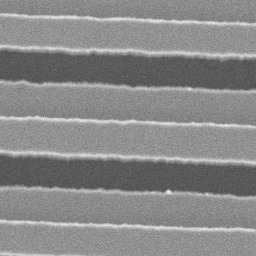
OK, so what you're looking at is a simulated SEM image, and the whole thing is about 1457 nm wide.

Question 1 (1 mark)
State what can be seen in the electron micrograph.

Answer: lines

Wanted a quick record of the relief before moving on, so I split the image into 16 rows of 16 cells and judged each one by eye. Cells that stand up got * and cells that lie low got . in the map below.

****************
****************
****************
.............***
................
************....
****************
****************
****************
****************
................
................
****************
****************
****************
****************